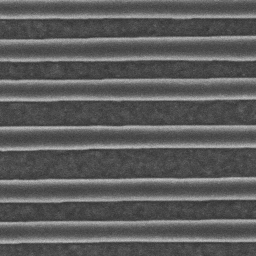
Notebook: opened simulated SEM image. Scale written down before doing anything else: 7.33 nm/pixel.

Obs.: lines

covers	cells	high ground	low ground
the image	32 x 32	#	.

################################
################################
................................
................................
................................
################################
################################
########..###...................
................................
................................
################################
################################
................................
................................
................................
................................
################################
################################
###########.....................
................................
................................
................................
................################
################################
################################
................................
................................
................................
################################
################################
................................
................................